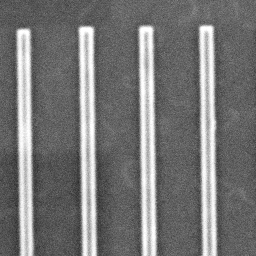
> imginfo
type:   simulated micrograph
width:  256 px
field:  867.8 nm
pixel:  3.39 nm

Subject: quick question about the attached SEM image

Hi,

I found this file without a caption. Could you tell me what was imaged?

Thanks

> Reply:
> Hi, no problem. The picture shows parallel lines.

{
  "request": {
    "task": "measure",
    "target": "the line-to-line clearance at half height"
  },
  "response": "172 nm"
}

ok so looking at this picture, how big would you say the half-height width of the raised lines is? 33.1 nanometers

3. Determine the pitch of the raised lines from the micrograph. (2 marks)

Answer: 207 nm